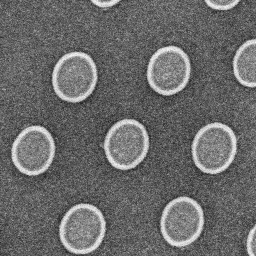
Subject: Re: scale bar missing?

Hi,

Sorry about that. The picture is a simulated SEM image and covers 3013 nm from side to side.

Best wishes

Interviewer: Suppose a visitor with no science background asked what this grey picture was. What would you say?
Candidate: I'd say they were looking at raised bodies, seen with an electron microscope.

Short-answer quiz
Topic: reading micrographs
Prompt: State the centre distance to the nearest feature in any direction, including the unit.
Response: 84.5 pixels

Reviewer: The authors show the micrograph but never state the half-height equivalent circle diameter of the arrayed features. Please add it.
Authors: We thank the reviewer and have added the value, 0.515 µm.